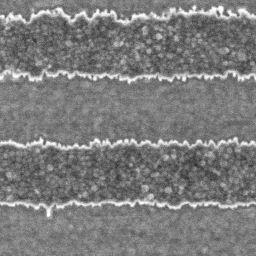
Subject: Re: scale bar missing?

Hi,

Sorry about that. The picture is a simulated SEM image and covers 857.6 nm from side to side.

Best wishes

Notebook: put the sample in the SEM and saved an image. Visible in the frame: one or a few lines or trenches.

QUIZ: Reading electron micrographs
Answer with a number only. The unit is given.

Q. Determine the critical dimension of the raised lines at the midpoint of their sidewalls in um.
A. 0.204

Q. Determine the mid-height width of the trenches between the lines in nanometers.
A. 223